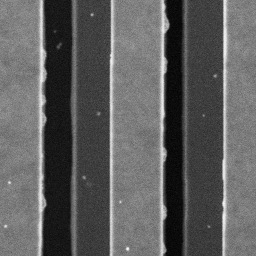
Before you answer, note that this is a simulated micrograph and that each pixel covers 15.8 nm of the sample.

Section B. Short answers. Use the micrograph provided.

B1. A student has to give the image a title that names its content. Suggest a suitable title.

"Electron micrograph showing lines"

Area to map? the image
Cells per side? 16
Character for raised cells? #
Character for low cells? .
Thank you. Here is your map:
###..#####..####
###..#####..####
###..#####..####
###..#####..####
###..#####..####
###..#####..####
###..#####..####
###..#####..####
###..#####..####
###..#####..####
###..#####..####
###..#####..####
###..#####..####
###..#####..####
###..#####..####
###..#####..####